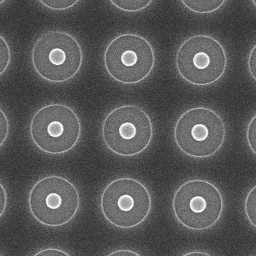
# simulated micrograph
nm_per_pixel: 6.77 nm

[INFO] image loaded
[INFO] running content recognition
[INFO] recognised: an array of small figures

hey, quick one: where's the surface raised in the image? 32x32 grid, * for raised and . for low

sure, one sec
******...*****....*****.....****
********************************
********************************
********************************
*****....******..***************
.****.....****.....****....*****
.***..**..***...*..***......****
.***..**..***..**..***..**..***.
.***......***......***......***.
*****....*****....*****....*****
*************************.******
********************************
********************************
******..*******..***************
.***.....*****....*****....*****
.***..*...***......***......***.
.***..**..***..**..***..**..***.
****......***......***......***.
*****....*****....*****....****.
********************************
********************************
********************************
*****...*******.****************
****.....****.....*****....*****
.***..*...***......***......***.
.***..*...***..**..***..**..***.
****.....****.....****......***.
*****....*****....****.....****.
************************..******
********************************
********************************
*****...*******.****************